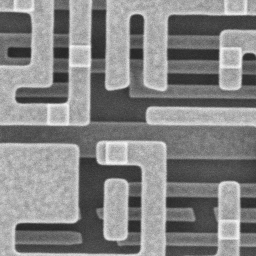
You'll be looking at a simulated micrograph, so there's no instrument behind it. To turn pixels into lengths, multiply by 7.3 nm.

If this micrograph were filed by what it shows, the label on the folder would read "wiring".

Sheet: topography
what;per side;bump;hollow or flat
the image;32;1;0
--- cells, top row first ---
11111110011001111111111111111111
00011110011001111111111111111111
00001110011001110011100000000000
00001110011001110011100000000000
00001110011001110011100000001111
00001110011001110011100000001111
00001110011001110011100000001111
00001110011001110011100000001100
11111110011001110011100000001100
11111110011001110011100000011100
11111100011001110011100000011100
11000000011000000000000000000000
11000000111000000000000000000000
11111111111000000001111000000000
11111111111000000011111111111111
11111111111000000001111111111111
00000000000000000000000000000000
00000000000000000000000000000000
11111111110011111111100000000000
11111111110011111111100000000000
11111111110001111111100000000000
11111111110000000011100000000000
11111111110000110011100000000000
11111111110001110011100000011100
11111111110001110011100000011100
11111111110001110011100000011100
11111111110001110011100000011100
11111111110001110011100000011100
11000000000001110011100000011100
11000000000001110011100000011100
11000000000000000011100000011100
11000000000000000111100000011100